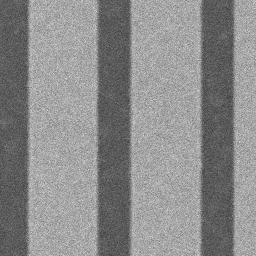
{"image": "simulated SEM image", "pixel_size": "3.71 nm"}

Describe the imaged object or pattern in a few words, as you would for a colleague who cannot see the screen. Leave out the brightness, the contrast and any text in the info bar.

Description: one or a few lines or trenches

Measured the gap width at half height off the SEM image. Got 128 nanometres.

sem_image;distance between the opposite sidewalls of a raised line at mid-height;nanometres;254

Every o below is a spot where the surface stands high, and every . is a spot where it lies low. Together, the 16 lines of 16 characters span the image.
..oooo..ooooo..o
..oooo..ooooo..o
..oooo..ooooo..o
..oooo..ooooo..o
..oooo..ooooo..o
..oooo..ooooo..o
..oooo..ooooo..o
..oooo..ooooo..o
..oooo..ooooo..o
..oooo..ooooo..o
..oooo..ooooo..o
..oooo..ooooo..o
..oooo..ooooo..o
..oooo..ooooo..o
..oooo..ooooo..o
..oooo..ooooo..o